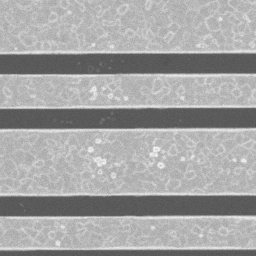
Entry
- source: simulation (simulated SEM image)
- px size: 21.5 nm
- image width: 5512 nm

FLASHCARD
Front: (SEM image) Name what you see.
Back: lines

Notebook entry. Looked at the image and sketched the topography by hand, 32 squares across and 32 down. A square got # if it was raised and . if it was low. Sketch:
################################
################################
################################
################################
################################
################################
################################
................................
................................
################################
################################
################################
################################
##############..................
................................
................................
################################
################################
################################
################################
################################
################################
################################
################################
................................
................................
................................
################################
################################
################################
################################
................................